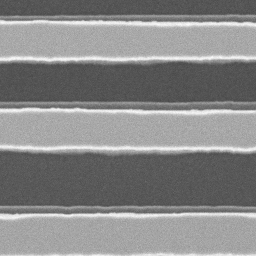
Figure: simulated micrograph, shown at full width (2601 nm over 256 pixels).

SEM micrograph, lines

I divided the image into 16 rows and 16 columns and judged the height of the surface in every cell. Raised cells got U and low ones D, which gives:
DDDDDDDDDDDDDDDD
UUUUUUUUUUUUUUUU
UUUUUUUUUUUUUUUU
UUUUUUUUUUUUUUUU
DDDDDDDDDDDDDDDD
DDDDDDDDDDDDDDDD
UUUUUUUUUUUUUUUU
UUUUUUUUUUUUUUUU
UUUUUUUUUUUUUUUU
DDDDDDDDDDDDDDDD
DDDDDDDDDDDDDDDD
DDDDDDDDDDDDDDDD
DDDDDDDDDDDDDDDD
UUUUUUUUUUUUUUUU
UUUUUUUUUUUUUUUU
UUUUUUUUUUUUUUUU